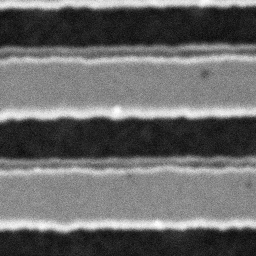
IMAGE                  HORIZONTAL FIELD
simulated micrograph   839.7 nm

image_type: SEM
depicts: lines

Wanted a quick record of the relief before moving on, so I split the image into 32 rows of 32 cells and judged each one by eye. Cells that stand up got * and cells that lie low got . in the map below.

********************************
................................
................................
................................
................................
................................
********************************
********************************
********************************
********************************
********************************
********************************
********************************
********************************
*****************************...
................................
................................
................................
................................
................................
********************************
********************************
********************************
********************************
********************************
********************************
********************************
********************************
**..******.*..*********....*....
................................
................................
................................